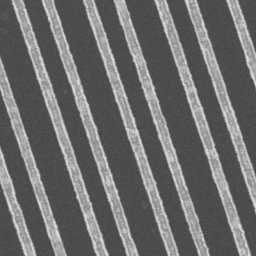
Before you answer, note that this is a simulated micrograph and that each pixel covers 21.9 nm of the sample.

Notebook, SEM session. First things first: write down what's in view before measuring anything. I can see parallel lines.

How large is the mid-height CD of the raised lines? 9.25 px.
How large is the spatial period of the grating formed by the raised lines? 740 nm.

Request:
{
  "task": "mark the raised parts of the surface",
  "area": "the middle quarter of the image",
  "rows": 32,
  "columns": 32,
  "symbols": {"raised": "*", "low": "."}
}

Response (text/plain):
***.......***.....**.........**.
.**........**.....***........**.
.**........**......**........**.
.***.......***.....***.......***
..**........**.....***........**
..**........***.....**........**
..***........**.....**........**
...**........**.....***........*
...**........**......**........*
...***.......***.....***.......*
...***........**.....***........
....**........**......**........
....***.......***.....**........
....***........**.....***.......
.....**........**......**.......
.....***.......***.....***......
......**........**.....***......
*.....**........***.....**......
*.....***.......***.....**......
*.....***........**.....***.....
**.....**........**......**.....
**.....***........**.....**.....
**.....***........**.....***....
***.....**........**......**....
.**.....***........**.....**....
.**......**........**.....***...
.***.....**........**......**...
..**.....***.......***.....**...
..**.....***........**.....***..
..***.....**........***.....**..
...**.....***.......***.....**..
...**.....***........**.....***.